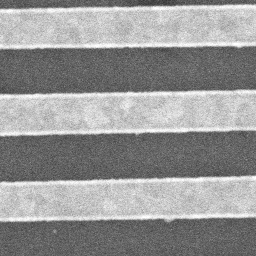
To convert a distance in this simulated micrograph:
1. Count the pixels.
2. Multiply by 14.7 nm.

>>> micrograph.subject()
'lines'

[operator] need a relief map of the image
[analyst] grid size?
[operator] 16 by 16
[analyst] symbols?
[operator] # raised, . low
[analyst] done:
......##########
################
################
................
................
................
################
################
................
................
................
################
################
################
................
................